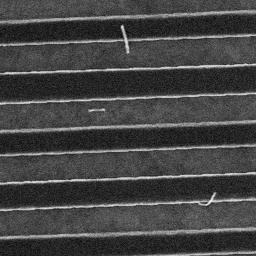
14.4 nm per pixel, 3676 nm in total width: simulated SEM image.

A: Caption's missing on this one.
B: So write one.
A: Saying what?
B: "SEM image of lines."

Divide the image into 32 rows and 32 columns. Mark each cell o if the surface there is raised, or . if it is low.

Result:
................................
................................
......oooooooooooooooooooooooooo
oooooooooooooooooooooooooooooooo
oooooooooooooooooooooooooooooo..
oo..............................
................................
................................
....................oooooooooooo
oooooooooooooooooooooooooooooooo
oooooooooooooooooooooooooooooooo
oooooooooooooooooooooooooooooooo
ooooooooooo.....................
................................
................................
...........................ooooo
.ooooooooooooooooooooooooooooooo
oooooooooooooooooooooooooooooooo
oooooooooooooooooooooooo........
................................
................................
................................
.........ooooooooooooooooooooooo
oooooooooooooooooooooooooooooooo
oooooooooooooooooooooooooooooooo
oooooooooooooooooooo............
................................
................................
................................
.......ooooooooooooooooooooooooo
oooooooooooooooooooooooooooooooo
oooooooooooooooooooooooooooooooo